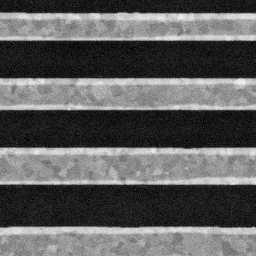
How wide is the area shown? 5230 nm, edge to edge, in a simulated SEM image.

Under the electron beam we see lines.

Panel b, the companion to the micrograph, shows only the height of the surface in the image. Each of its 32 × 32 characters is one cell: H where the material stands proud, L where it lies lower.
LLLLLLLLLLLLLLLLLLLLLLLLLLLLLLLL
LLLLLLLLLLLLLLLLLLLLLLLLLLLLLLLL
HHHHHHHHHHHHHHHHHHHHHHHHHHHHHHHH
HHHHHHHHHHHHHHHHHHHHHHHHHHHHHHHH
HHHHHHHHHHHHHHHHHHHHHHHHHHHHHHHH
LLLLLLLLLLLLLLLLLLLLLLLLLLLLLLLL
LLLLLLLLLLLLLLLLLLLLLLLLLLLLLLLL
LLLLLLLLLLLLLLLLLLLLLLLLLLLLLLLL
LLLLLLLLLLLLLLLLLLLLLLLLLLLLLLLL
LLLLLLLLLLLLLLLLLLLLLLLLLLLLLLLL
HHHHHHHHHHHHHHHHHHHHHHHHHHHHHHHH
HHHHHHHHHHHHHHHHHHHHHHHHHHHHHHHH
HHHHHHHHHHHHHHHHHHHHHHHHHHHHHHHH
LLLLLLLLLLLHHHHHHHHHHHLLLLHHHHHL
LLLLLLLLLLLLLLLLLLLLLLLLLLLLLLLL
LLLLLLLLLLLLLLLLLLLLLLLLLLLLLLLL
LLLLLLLLLLLLLLLLLLLLLLLLLLLLLLLL
LLLLLLLLLLLLLLLLLLLLLLLLLLLLLLLL
LLLLLLLLLLLLLLLLLLLLLLLLLLLLLLLL
HHHHHHHHHHHHHHHHHHHHHHHHHHHHHHHH
HHHHHHHHHHHHHHHHHHHHHHHHHHHHHHHH
HHHHHHHHHHHHHHHHHHHHHHHHHHHHHHHH
HHHHHHHHHHHHHHHHHHHHHHHHHHHHHHHH
LLLLLLLLLLLLLLLLLLLLLLLLLLLLLLLL
LLLLLLLLLLLLLLLLLLLLLLLLLLLLLLLL
LLLLLLLLLLLLLLLLLLLLLLLLLLLLLLLL
LLLLLLLLLLLLLLLLLLLLLLLLLLLLLLLL
LLLLLLLLLLLLLLLLLLLLLLLLLLLLLLLL
LLLLLLLLLLLLLLLLLLLLLLLLLLLLLLLL
HHHHHHHHHHHHHHHHHHHHHHHHHHHHHHHH
HHHHHHHHHHHHHHHHHHHHHHHHHHHHHHHH
HHHHHHHHHHHHHHHHHHHHHHHHHHHHHHHH